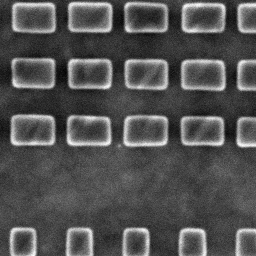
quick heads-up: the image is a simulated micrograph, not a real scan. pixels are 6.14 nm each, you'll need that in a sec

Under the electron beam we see wiring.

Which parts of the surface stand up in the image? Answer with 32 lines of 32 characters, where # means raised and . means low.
..####...#####..####............
..#####..#####..#####..#####..##
..#####..#####..#####..#####..##
..#####..#####..#####..#####..##
................................
................................
................................
..####...#####..####............
..#####..#####..#####..#####..##
..#####..#####..#####..#####..##
..#####..#####..#####..#####..##
................................
................................
................................
..###...........................
.######.######..#####..#####..##
.######.######..#####..#####..##
.######.######..#####..#####..##
................................
................................
................................
................................
................................
................................
................................
................................
................................
................................
................................
.###....####....###...####....##
.###....####...####...####....##
.###....####...####...####....##